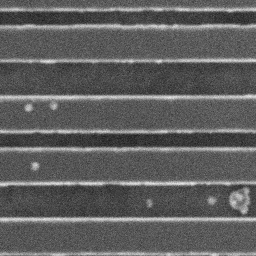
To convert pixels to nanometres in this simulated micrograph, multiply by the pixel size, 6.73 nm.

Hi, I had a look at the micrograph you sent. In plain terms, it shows lines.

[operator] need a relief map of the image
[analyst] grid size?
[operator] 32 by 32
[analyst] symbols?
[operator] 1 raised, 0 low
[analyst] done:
11111111111111111111111111111111
00000000000000000000000000000000
00000000000000000000000000000000
11111111111111111111111111111111
11111111111111111111111111111111
11111111111111111111111111111111
11111111111111111111111111111111
11111111111111111111111111111111
00000000000000000000000000000000
00000000000000000000000000000000
00000000000000000000000000000000
00000000000000000000000000000000
11111111111111111111111111111111
11111111111111111111111111111111
11111111111111111111111111111111
11111111111111111111111111111111
11110111111111111111101000000000
00000000000000000000000000000000
00000000000000000000000000000000
11111111111111111111111111111111
11111111111111111111111111111111
11111111111111111111111111111111
11111111111111111111111111111111
00000000000000000000000000000000
00000000000000000000000000000000
00000000000000000000000000000000
00000000000000000000000000000000
11111111111111111111111111111111
11111111111111111111111111111111
11111111111111111111111111111111
11111111111111111111111111111111
11111111111111111111111111111111